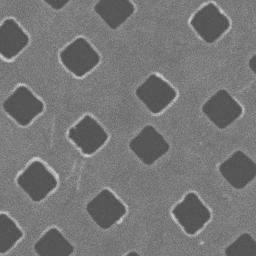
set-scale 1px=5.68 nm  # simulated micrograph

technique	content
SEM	a regular array of holes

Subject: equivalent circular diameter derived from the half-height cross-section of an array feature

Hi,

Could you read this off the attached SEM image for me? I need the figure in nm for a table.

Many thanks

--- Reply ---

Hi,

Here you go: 200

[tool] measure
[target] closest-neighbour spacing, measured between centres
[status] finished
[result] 400 nm